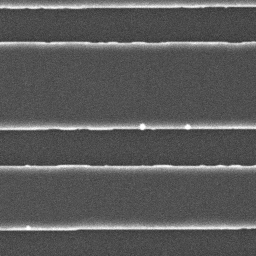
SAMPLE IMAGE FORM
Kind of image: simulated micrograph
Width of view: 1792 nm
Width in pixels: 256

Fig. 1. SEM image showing lines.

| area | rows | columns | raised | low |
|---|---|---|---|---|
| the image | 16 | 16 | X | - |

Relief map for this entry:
---X------------
----------------
----------------
XXXXXXXXXXXXXXXX
XXXXXXXXXXXXXXXX
XXXXXXXXXXXXXXXX
XXXXXXXXXXXXXXXX
XXXXXXXXXXXXXXXX
----------------
----------------
XXXXXXXXXXXXXXXX
XXXXXXXXXXXXXXXX
XXXXXXXXXXXXXXXX
XXXXXXXXXXXXXXXX
----------------
----------------